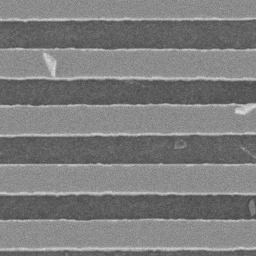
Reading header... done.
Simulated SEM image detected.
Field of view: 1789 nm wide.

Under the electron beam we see lines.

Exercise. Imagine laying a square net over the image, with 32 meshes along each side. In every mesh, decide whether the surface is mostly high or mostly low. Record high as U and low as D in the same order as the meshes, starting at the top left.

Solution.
UUUUUUUUUUUUUUUUUUUUUUUUUUUUUUUU
UUUUUUUUUUUUUUUUUUUUUUUUUUUUUUUU
UDUUUUDDUDDDDDDDDDDDDDDDDDDDDDDD
DDDDDDDDDDDDDDDDDDDDDDDDDDDDDDDD
DDDDDDDDDDDDDDDDDDDDDDDDDDDDDDDD
DDDDDDDDDDDDDDDDDDDDDDDDDDDDDDDD
UUUUUUUUUUUUUUUUUUUUUUUUUUUUUUUU
UUUUUUUUUUUUUUUUUUUUUUUUUUUUUUUU
UUUUUUUUUUUUUUUUUUUUUUUUUUUUUUUU
UUUUUUUUUUUUUUUUUUUUUUUUUUUUUUUU
DDDDDDDDDDDDDDDDDDDDDDDDDDDDDDDD
DDDDDDDDDDDDDDDDDDDDDDDDDDDDDDDD
DDDDDDDDDDDDDDDDDDDDDDDDDDDDDDDD
UUUUUUUUUUUUUUUUUUUUUUUUUUUUUUUU
UUUUUUUUUUUUUUUUUUUUUUUUUUUUUUUU
UUUUUUUUUUUUUUUUUUUUUUUUUUUUUUUU
UUUUUUUUUUUUUUUUUUUUUUUUUUUUUUUU
DDDDDDDDDDDDDDDDDDDDDDDDDDDDDDDD
DDDDDDDDDDDDDDDDDDDDDDDDDDDDDDDD
DDDDDDDDDDDDDDDDDDDDDDDDDDDDDDDD
DDDDDDDDDDDDUDDDDDDDUDDDDUUDDDUU
UUUUUUUUUUUUUUUUUUUUUUUUUUUUUUUU
UUUUUUUUUUUUUUUUUUUUUUUUUUUUUUUU
UUUUUUUUUUUUUUUUUUUUUUUUUUUUUUUU
DDDDDDDDDDDDDDDDDDDDDDDDDDDDDDDD
DDDDDDDDDDDDDDDDDDDDDDDDDDDDDDDD
DDDDDDDDDDDDDDDDDDDDDDDDDDDDDDDD
DDDDDDDUUDDDDDDUDUUUUUUDUUDDDDUU
UUUUUUUUUUUUUUUUUUUUUUUUUUUUUUUU
UUUUUUUUUUUUUUUUUUUUUUUUUUUUUUUU
UUUUUUUUUUUUUUUUUUUUUUUUUUUUUUUU
DDDDDDDDDDDDDDDDDDDDDDDDDDDDDDDD